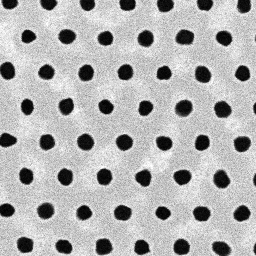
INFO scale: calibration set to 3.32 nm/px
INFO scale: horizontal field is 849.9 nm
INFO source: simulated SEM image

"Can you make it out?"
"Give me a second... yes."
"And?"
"a regular array of holes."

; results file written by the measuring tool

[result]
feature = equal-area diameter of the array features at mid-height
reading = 0.0507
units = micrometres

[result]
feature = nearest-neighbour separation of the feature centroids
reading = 128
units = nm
